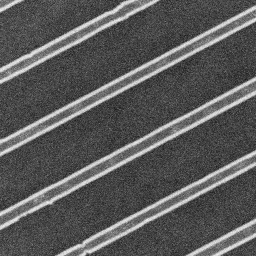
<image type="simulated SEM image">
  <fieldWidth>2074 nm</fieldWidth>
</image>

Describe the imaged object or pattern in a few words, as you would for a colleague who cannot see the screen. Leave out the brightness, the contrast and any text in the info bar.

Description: one or a few lines or trenches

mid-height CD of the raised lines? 11.2 px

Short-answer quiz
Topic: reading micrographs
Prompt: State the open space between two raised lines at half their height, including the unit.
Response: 422 nanometers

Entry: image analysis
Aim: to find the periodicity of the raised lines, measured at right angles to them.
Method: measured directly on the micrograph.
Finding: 63.8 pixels